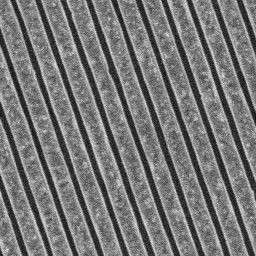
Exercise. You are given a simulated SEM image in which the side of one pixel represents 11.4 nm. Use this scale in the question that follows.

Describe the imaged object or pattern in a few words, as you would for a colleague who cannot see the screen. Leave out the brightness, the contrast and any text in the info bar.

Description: parallel lines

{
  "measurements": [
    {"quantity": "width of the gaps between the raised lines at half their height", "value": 79.2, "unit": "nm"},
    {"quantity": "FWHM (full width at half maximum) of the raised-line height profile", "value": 191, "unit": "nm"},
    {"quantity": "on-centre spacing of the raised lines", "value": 271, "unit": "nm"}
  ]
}